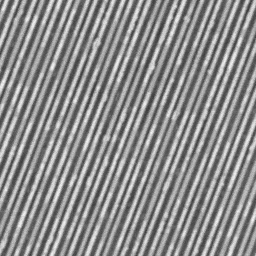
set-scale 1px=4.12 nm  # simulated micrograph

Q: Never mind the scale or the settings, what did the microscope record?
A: parallel lines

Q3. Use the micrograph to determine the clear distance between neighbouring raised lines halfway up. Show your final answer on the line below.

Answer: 4.42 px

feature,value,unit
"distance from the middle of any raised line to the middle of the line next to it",0.0342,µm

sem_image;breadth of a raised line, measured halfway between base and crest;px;2.67